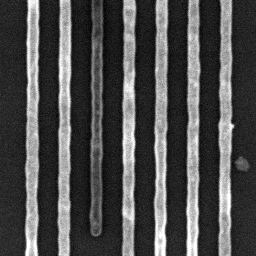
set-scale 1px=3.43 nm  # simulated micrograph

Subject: groups of lines, slits or small figures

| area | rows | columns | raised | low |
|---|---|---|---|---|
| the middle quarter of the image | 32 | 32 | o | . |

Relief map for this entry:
o......oo......oo......ooo.....o
o......oo......ooo.....ooo.....o
o......oo......ooo.....ooo.....o
o......oo......oo......oo......o
o......oo......oo......ooo.....o
o......oo......oo......ooo.....o
o......oo......oo......ooo.....o
o......oo......oo......ooo.....o
o......oo......oo......ooo.....o
o......oo......ooo.....ooo.....o
o......oo......ooo.....ooo.....o
o......oo......ooo.....oo......o
o......oo......ooo.....oo......o
o......oo......oo......oo......o
o......oo......oo......ooo.....o
o......oo......oo......ooo.....o
o......oo......oo......ooo.....o
o......oo......oo......oo......o
o......oo......oo......oo......o
o......oo......oo......oo......o
o......oo......oo......oo......o
o......oo......oo......oo......o
o......oo......oo......oo......o
o......oo......oo......oo......o
o......oo......oo......oo......o
o......oo......oo......oo......o
o......oo......oo......oo......o
o......oo......oo......oo......o
o......oo......oo......oo......o
o......oo......oo......oo......o
o......oo......oo......oo......o
o......oo......oo......oo......o